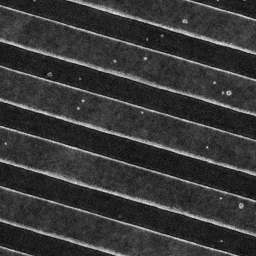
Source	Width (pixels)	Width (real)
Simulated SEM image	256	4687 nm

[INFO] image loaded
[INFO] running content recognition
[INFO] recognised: lines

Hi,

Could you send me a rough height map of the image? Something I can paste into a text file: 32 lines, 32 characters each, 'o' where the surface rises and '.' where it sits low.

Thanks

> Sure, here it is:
..........ooooooooooooooo.......
ooo...........ooooooooooooooo...
oooooo...........ooooooooooooooo
oooooooooo...........ooooooooooo
ooooooooooooo...........oooooooo
.oooooooooooooooo..........ooooo
.....ooooooooooooooo...........o
........ooooooooooooooo.........
o..........oooooooooooooooo.....
oooo...........ooooooooooooooo..
oooooooo..........oooooooooooooo
ooooooooooo...........oooooooooo
ooooooooooooooo..........ooooooo
...ooooooooooooooo...........ooo
......ooooooooooooooo...........
..........ooooooooooooooo.......
ooo..........ooooooooooooooo....
oooooo...........ooooooooooooooo
ooooooooo...........oooooooooooo
ooooooooooooo...........oooooooo
.ooooooooooooooo...........ooooo
.....ooooooooooooooo...........o
........ooooooooooooooo.........
o..........ooooooooooooooo......
oooo...........ooooooooooooooo..
oooooooo...........ooooooooooooo
ooooooooooo...........oooooooooo
oooooooooooooo...........ooooooo
...ooooooooooooooo...........ooo
......ooooooooooooooo...........
..........ooooooooooooooo.......
ooo..........ooooooooooooooo....